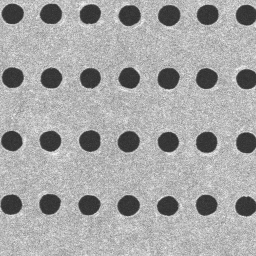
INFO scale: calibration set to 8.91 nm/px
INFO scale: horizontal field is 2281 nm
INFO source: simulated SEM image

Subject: a regular array of holes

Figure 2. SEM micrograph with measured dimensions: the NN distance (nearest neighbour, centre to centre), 0.345 um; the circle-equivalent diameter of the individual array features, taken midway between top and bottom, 192 nm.